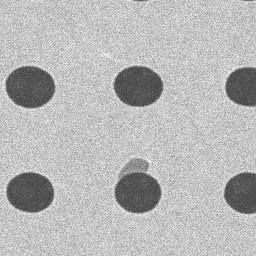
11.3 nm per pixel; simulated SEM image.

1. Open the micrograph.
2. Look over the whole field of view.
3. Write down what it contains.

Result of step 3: holes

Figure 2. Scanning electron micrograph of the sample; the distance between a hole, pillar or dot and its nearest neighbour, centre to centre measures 1200 nm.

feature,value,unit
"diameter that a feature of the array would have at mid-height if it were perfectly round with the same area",509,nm